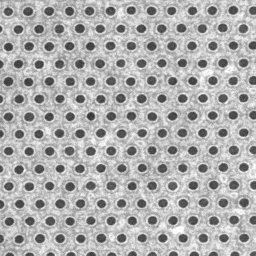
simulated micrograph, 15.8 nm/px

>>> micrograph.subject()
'a regular array of holes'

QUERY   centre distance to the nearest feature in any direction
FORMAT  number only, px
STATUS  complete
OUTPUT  19.8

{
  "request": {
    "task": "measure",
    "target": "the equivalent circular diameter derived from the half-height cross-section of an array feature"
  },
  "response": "158 nm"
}